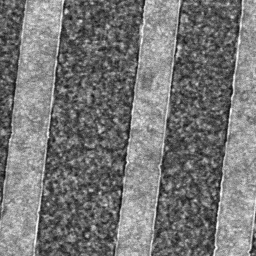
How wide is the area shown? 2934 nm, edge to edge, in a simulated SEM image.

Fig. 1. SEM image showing one or a few lines or trenches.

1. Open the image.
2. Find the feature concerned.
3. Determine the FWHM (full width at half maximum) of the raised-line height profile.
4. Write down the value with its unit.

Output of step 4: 407 nm